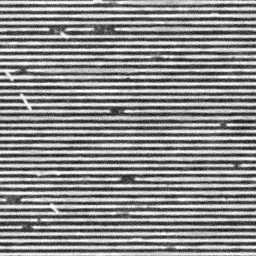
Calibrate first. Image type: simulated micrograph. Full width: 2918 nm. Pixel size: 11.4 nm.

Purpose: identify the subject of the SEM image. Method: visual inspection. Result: parallel lines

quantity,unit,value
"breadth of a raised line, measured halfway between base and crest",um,0.0214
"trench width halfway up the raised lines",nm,52.7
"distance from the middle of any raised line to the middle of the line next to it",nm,77.5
